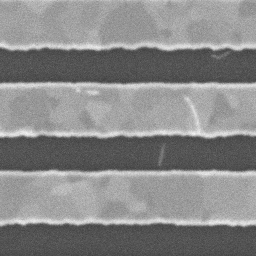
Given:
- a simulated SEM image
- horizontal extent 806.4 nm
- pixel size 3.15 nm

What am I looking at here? lines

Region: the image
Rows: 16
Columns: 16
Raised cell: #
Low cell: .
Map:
################
################
################
................
................
################
################
################
#...###.#...##..
................
................
################
################
################
................
................